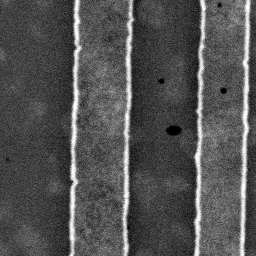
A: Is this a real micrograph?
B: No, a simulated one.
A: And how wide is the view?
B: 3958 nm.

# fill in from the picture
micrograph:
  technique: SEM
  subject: one or a few lines or trenches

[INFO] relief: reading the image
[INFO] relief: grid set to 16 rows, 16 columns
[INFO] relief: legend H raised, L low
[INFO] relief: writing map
LLLLLHHHLLLLLHHL
LLLLLHHHLLLLLHHL
LLLLLHHHLLLLLHHL
LLLLLHHHLLLLLHHL
LLLLLHHHLLLLHHHL
LLLLLHHHLLLLLHHL
LLLLLHHHLLLLHHHL
LLLLLHHHLLLLHHHL
LLLLLHHHLLLLHHHL
LLLLLHHHLLLLHHHL
LLLLLHHHLLLLHHHL
LLLLLHHHLLLLHHHL
LLLLLHHHLLLLHHHL
LLLLHHHHLLLLHHHL
LLLLLHHHLLLLHHHL
LLLLHHHHLLLLHHHL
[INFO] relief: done